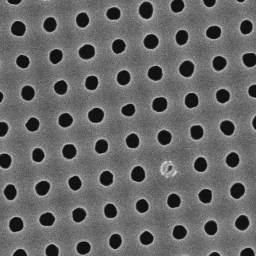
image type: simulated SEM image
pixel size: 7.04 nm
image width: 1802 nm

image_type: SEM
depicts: a regular array of holes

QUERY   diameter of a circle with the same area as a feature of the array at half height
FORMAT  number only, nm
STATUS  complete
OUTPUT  96.7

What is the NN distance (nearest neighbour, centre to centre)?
222 nm